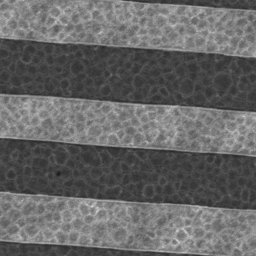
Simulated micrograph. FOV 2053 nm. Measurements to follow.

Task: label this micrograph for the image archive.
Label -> one or a few lines or trenches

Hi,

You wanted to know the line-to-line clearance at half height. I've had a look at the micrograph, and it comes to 443 nm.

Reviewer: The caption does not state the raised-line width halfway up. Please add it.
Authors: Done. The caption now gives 351 nm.